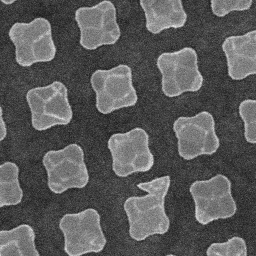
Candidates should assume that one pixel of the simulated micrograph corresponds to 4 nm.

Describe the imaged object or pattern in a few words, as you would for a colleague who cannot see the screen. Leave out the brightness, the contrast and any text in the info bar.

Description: a regular array of raised bodies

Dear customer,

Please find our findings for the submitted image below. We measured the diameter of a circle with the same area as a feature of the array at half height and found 180 nm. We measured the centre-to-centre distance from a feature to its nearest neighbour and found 262 nanometers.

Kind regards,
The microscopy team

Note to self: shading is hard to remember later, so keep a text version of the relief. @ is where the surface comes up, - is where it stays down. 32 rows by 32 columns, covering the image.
------------@@----@@@@@---@@@@@-
----------@@@@----@@@@@----@@---
----@@----@@@@@---@@@@@---------
-@@@@@----@@@@@---@@@-----------
-@@@@@----@@@@@---------------@@
--@@@@@---@@@---------------@@@@
--@@@@@---------------@@----@@@@
--@@@@--------------@@@@@---@@@@
--------------@@----@@@@@----@@@
------------@@@@----@@@@@----@@-
-------@----@@@@----@@@@@-------
----@@@@----@@@@@----@@---------
---@@@@@----@@@@@---------------
----@@@@@---@@@---------------@@
----@@@@@---------------@@----@@
----@@@@--------------@@@@@----@
@---------------@@----@@@@@----@
--------------@@@@----@@@@@----@
--------@@----@@@@@---@@@@@-----
------@@@@----@@@@@----@@-------
@@---@@@@@----@@@@@-------------
@@----@@@@@---@@@---------------
@@----@@@@@--------@@-----@@----
@@@---@@@---------@@@---@@@@@---
@@@---------------@@@---@@@@@---
@@--------------@@@@----@@@@@---
----------@@----@@@@@----@@@@---
--------@@@@----@@@@@----@@-----
--@@----@@@@@---@@@@@-----------
@@@@----@@@@@---@@@-------------
@@@@----@@@@@--------------@@@@-
@@@@@---@@@---------------@@@@@-